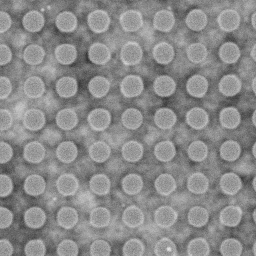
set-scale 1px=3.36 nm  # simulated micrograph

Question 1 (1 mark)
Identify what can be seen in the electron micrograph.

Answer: an array of small figures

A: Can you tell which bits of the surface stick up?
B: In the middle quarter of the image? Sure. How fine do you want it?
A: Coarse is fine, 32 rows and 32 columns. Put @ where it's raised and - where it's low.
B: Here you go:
--------------------------------
--------------------------------
--------------------------------
@@------@@-----@@@@-----@@@-----
@@@----@@@@----@@@@----@@@@----@
@@@---@@@@@----@@@@----@@@@@---@
@@@---@@@@@----@@@@----@@@@----@
@@-----@@@-----@@@@----@@@@-----
--------------------------------
--------------------------------
--------------------------------
@@------@@------@@------@@@-----
@@@----@@@@----@@@@----@@@@----@
@@@---@@@@@---@@@@@@---@@@@@---@
@@@---@@@@@----@@@@----@@@@@---@
@@@----@@@@----@@@@----@@@@-----
--------------------------------
--------------------------------
--------------------------------
--------@--------@------@@------
@@@----@@@@----@@@@----@@@@----@
@@@---@@@@@----@@@@----@@@@@---@
@@@---@@@@@----@@@@----@@@@@---@
@@@----@@@@----@@@@----@@@@-----
--------------------------------
--------------------------------
--------------------------------
--------------------------------
@@@----@@@@----@@@@----@@@@----@
@@@----@@@@----@@@@@---@@@@@---@
@@@----@@@@----@@@@@---@@@@@---@
@@@----@@@@----@@@@----@@@@-----